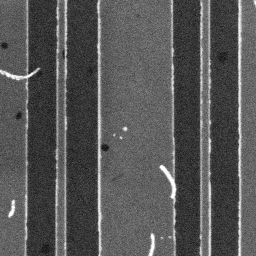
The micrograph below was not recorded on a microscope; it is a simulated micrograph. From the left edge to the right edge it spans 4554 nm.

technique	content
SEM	lines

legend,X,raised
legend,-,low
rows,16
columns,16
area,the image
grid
XX----XXXXX----X
XX----XXXXX----X
XX----XXXXX----X
XX----XXXXX----X
XX----XXXXX----X
XX----XXXXX----X
XX----XXXXX----X
XX----XXXXX----X
XX----XXXXX----X
XX----XXXXX----X
XX----XXXXX----X
XX----XXXXX----X
XX----XXXXX----X
XX----XXXXX----X
XX----XXXXX----X
XX----XXXXX----X